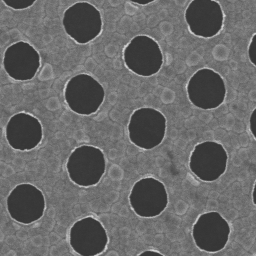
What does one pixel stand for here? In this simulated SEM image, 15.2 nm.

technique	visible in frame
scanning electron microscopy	a regular array of holes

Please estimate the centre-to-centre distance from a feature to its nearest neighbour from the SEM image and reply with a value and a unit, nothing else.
1.07 um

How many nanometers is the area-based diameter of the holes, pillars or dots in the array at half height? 586